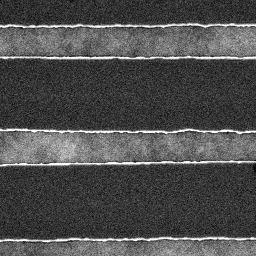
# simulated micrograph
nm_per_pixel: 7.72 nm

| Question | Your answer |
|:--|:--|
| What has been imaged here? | lines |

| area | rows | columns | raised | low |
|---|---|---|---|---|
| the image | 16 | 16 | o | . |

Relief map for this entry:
oooooooooooooooo
oooooooooooooooo
................
................
oooooooooooooooo
oooooooooooooooo
oooooooooooooooo
oooooooooooooooo
................
................
oooooooooooooooo
oooooooooooooooo
oooooooooooooooo
oooooooooooooooo
oooooooooooooooo
................